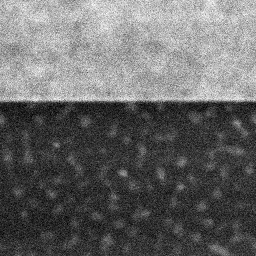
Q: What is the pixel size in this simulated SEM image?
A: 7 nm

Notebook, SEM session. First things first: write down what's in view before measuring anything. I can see one or a few lines or trenches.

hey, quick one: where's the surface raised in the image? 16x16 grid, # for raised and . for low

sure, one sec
################
################
################
################
################
################
................
................
................
................
................
................
................
................
................
................